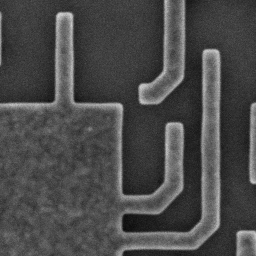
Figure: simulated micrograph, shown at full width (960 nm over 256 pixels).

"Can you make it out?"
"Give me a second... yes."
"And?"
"wiring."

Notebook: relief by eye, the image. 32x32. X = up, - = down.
---------------------XX---------
---------------------XX---------
-------XX------------XX---------
-------XX------------XX---------
-------XX------------XX---------
-------XX------------XX---------
-------XX------------XX---X-----
-------XX------------XX--XX-----
-------XX-----------XXX--XX-----
-------XX-----------XXX--XX-----
-------XX---------XXXX---XX-----
-------XX--------XXXX----XX-----
-------XX--------XXX-----XX-----
XXXXXXXXXXXXXXX----------XX----X
XXXXXXXXXXXXXXX----------XX----X
XXXXXXXXXXXXXXX------X---XX----X
XXXXXXXXXXXXXXX------XX--XX----X
XXXXXXXXXXXXXXX------XX--XX----X
XXXXXXXXXXXXXXX------XX--XX----X
XXXXXXXXXXXXXXX------XX--XX----X
XXXXXXXXXXXXXXX------XX--XX----X
XXXXXXXXXXXXXXX------XX--XX----X
XXXXXXXXXXXXXXX------XX--XX----X
XXXXXXXXXXXXXXX-----XXX--XX-----
XXXXXXXXXXXXXXXX--XXXX---XX-----
XXXXXXXXXXXXXXXXXXXXX----XX-----
XXXXXXXXXXXXXXXXXXXX-----XX-----
XXXXXXXXXXXXXXX----------XX-----
XXXXXXXXXXXXXXX---------XXX-----
XXXXXXXXXXXXXXXXXXXXXXXXXX----XX
XXXXXXXXXXXXXXXXXXXXXXXXX-----XX
XXXXXXXXXXXXXXX---------------XX